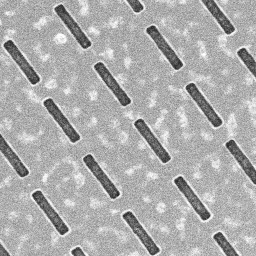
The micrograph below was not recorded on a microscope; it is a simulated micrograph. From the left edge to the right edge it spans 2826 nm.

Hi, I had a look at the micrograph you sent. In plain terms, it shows a regular array of holes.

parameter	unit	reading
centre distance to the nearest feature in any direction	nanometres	689